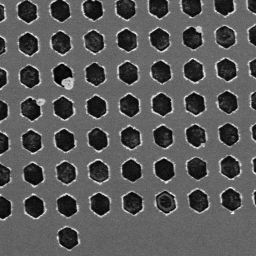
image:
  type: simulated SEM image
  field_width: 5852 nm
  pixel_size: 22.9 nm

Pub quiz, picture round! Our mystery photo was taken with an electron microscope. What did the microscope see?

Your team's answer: a regular array of holes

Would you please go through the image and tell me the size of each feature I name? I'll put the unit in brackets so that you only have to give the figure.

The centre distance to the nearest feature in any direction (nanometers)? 737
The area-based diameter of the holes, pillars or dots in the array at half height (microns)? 0.478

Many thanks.